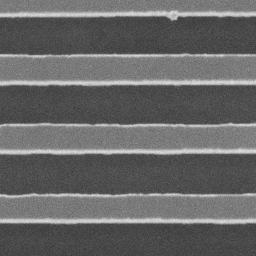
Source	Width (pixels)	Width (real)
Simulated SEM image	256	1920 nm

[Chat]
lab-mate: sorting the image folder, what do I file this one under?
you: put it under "lines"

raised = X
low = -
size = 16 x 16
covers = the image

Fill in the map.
XXXXXXXXXXXXXXXX
----------------
----------------
XXXXXXXXXXXXXXXX
XXXXXXXXXXXXXXXX
----------------
----------------
----------------
XXXXXXXXXXXXXXXX
XXXXXXXXXXXXXXXX
----------------
----------------
XXXXXXXXXXXXXXXX
XXXXXXXXXXXXXXXX
----------------
----------------